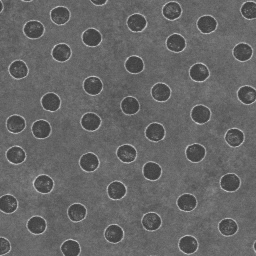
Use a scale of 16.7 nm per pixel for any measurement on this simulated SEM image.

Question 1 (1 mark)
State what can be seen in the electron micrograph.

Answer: a regular array of holes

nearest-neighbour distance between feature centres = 622 nm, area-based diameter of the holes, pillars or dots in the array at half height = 0.31 um